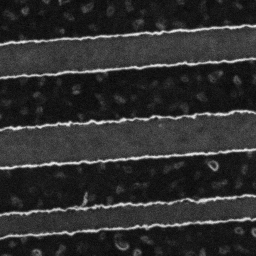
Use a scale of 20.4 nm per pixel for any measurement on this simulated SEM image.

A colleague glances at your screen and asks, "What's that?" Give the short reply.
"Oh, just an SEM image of one or a few lines or trenches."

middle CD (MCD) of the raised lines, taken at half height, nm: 1000